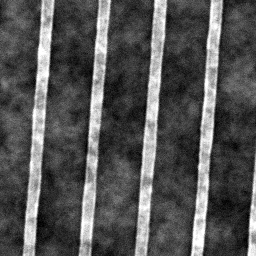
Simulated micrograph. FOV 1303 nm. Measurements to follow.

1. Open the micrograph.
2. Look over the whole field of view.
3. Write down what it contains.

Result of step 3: parallel lines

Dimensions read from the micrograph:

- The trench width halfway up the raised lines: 232 nm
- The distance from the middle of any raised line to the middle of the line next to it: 0.286 microns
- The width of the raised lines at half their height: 51.4 nm